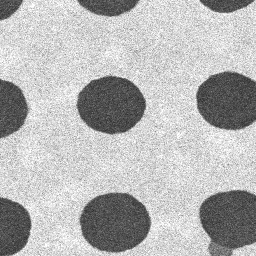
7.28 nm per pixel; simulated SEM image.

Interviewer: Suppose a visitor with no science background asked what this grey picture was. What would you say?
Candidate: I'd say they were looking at holes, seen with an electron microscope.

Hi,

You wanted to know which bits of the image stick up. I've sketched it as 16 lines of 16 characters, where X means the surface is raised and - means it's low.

-XXXX---XXXXX--X
XXXXXXXXXXXXXXXX
XXXXXXXXXXXXXXXX
XXXXXXXXXXXXXXXX
XXXXXXXXXXXXXXXX
-XXXX----XXX----
--XXX----XXX----
--XXX----XXXX---
XXXXXXXXXXXXXXXX
XXXXXXXXXXXXXXXX
XXXXXXXXXXXXXXXX
XXXXXXXXXXXXXXXX
-XXXXX---XXXX---
--XXX----XXXX---
--XXX----XXXX---
-XXXXX--XXXXX--X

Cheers